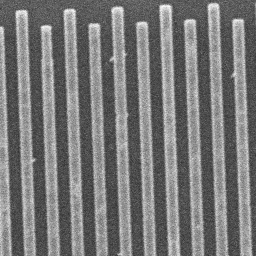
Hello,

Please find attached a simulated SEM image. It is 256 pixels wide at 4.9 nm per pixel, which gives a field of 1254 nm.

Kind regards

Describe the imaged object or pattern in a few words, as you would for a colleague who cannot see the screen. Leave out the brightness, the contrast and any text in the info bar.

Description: parallel lines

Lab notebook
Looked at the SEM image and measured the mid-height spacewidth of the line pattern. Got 66.1 nm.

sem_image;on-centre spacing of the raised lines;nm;118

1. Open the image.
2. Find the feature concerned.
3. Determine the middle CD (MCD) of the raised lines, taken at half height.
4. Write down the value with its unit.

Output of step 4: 10.1 pixels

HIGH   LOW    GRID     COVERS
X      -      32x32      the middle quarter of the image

-XX----XX----XX----XX----XX----X
-XX----XX----XX----XX----XX----X
-XX----XX----XX----XX----XX----X
-XX----XX----XX----XX----XX----X
-XX----XX----XX----XX----XX----X
-XX----XX----XX----XX----XX----X
-XX----XX----XX----XX----XX----X
-XX----XX----XX----XX----XX----X
-XX----XX----XX----XX----XX----X
-XX----XX----XX----XX----XX----X
-XX----XX----XX----XX----XX----X
-XXX---XX----XX----XX----XX----X
-XXX---XX----XXX---XXX---XX----X
-XXX---XX----XXX---XXX---XX----X
-XXX---XXX---XX----XXX---XX----X
-XXX---XXX---XX----XXX---XXX---X
-XXX---XXX---XXX---XXX---XXX---X
-XXX---XXX---XXX---XXX---XXX---X
-XXX---XXX---XXX---XXX---XXX---X
-XXX---XXX---XXX---XXX---XXX---X
-XXX---XXX---XXX---XXX---XXX---X
-XXX---XXX---XXX----XX---XXX---X
-XXX----XX---XXX---XXX---XXX---X
-XXX----XX---XXX---XXX----XX---X
-XXX----XX---XXX----XX----XX---X
-XXX----XX----XX----XX----XX---X
--XX----XX----XX----XX----XX----
--XX----XX----XX----XX----XX----
--XX----XX----XX----XX----XX----
--XX----XX----XX----XX----XX----
--XX----XX----XX----XX----XX----
--XX----XX----XX----XX----XX----